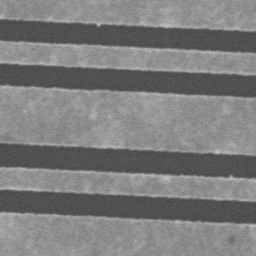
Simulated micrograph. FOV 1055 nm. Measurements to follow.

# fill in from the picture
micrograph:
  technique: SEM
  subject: lines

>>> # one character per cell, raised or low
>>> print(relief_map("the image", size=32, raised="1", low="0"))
11111111111111111111111111111111
11111111111111111111111111111111
00111111111111111111111111111111
00000000000000000000001111111111
00000000000000000000000000000000
11111110000000000000000000000000
11111111111111111111111111110000
11111111111111111111111111111111
00000000000000111111111111111111
00000000000000000000000000000000
00000000000000000000000000000000
11111111111111100000000000000000
11111111111111111111111111111111
11111111111111111111111111111111
11111111111111111111111111111111
11111111111111111111111111111111
11111111111111111111111111111111
11111111111111111111111111111111
00000000000000111111111111111111
00000000000000000000000000000000
00000000000000000000000000000000
11111111111100000000000000000000
11111111111111111111111111111111
11111111111111111111111111111111
00000000000000000011111111111111
00000000000000000000000000000000
00000000000000000000000000000000
11111111111111111111000000000000
11111111111111111111111111111111
11111111111111111111111111111111
11111111111111111111111111111111
11111111111111111111111111111111